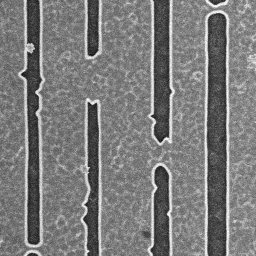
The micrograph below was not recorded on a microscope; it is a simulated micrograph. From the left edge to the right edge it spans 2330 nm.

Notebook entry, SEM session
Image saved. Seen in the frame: one or a few lines or trenches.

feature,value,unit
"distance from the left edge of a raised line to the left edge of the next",569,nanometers